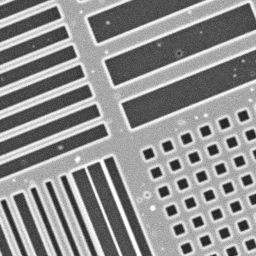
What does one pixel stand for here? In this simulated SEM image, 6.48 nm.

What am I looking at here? groups of lines, slits or small figures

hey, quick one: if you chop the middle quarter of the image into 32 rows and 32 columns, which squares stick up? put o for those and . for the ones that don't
ooo.ooooooo...............oooooo
.....oooooo............ooooooooo
.....oooooo..........ooooooooooo
.....ooooooo......oooooooooooo..
..oooooooooo....ooooooooooo.....
ooooo.ooooooooooooooooooo.......
oo.....ooooooooooooooo..........
.......ooooooooooooo............
.......ooooooooooo..............
....ooooooooooo.................
..oooo..oooooo..................
oooo.....oooooo..............ooo
o........oooooo............ooooo
........oooooooo........oooooooo
......oooooooooo.....ooooooooooo
...ooooo..oooooo...ooooooooooooo
.oooo......ooooooooooooooooooooo
ooo........ooooooooooooooooooo..
o.........ooooooooooooooooooo...
.......oooooooooooooooooo..ooo..
.....oooooooooooooooooooo..ooooo
..oooooooooooooooooo..ooo..ooooo
oooooooooooooooooooo...oooooooo.
ooooooooooo.oooooooo..ooooooooo.
oooooooo.o...ooooooooooooo...ooo
oooooo...o...ooooooooooooo...ooo
ooo.......o...oooooooo..ooo.oooo
oo........o...oooooooo...ooooooo
.o............oooooooo.ooooooooo
.oo........o...ooooooooooooo...o
.oo........o...ooooooooooooo...o
..o.........o...ooooooo...oooooo